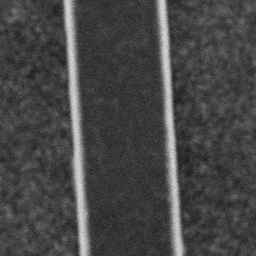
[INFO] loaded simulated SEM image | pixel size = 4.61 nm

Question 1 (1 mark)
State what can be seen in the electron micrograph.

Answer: one or a few lines or trenches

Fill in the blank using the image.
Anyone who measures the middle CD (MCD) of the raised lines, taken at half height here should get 440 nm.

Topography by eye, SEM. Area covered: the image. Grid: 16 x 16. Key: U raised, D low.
DDDDUUUUUUDDDDDD
DDDDUUUUUUDDDDDD
DDDDUUUUUUDDDDDD
DDDDUUUUUUDDDDDD
DDDDUUUUUUDDDDDD
DDDDDUUUUUUDDDDD
DDDDDUUUUUUDDDDD
DDDDDUUUUUUDDDDD
DDDDDUUUUUUDDDDD
DDDDDUUUUUUDDDDD
DDDDDUUUUUUDDDDD
DDDDDUUUUUUDDDDD
DDDDDUUUUUUDDDDD
DDDDDUUUUUUDDDDD
DDDDDUUUUUUDDDDD
DDDDDUUUUUUDDDDD